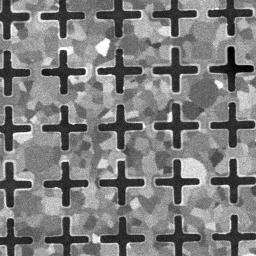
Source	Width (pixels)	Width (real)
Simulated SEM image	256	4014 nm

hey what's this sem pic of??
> an array of small figures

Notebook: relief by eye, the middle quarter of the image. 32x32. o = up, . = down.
.ooooooooooo...oooooooo.........
......oo............oo..........
......oo............ooo.........
.oooooooooooo..oooooooooooo..ooo
.oooooooooooo..oooooooooooo..ooo
.oooooooooooo..oooooooooooo..ooo
.oooooooooooo..oooooooooooo..ooo
.ooooooooooooooooooooooooooooooo
oooooooooooooooooooooooooooooooo
oooooooooooooooooooooooooooooooo
.oooooooooooo..oooooooooooo..ooo
.oooooooooooo..oooooooooooo..ooo
.oooooooooooo..oooooooooooo..ooo
.oooooooooooo..oooooooooooo..ooo
.ooooooooooo....ooooooo.........
......ooo...........oo..........
......ooo...........ooo.........
.oooooooooooo..oooooooooooo...oo
.oooooooooooo..oooooooooooo...oo
.oooooooooooo..oooooooooooo...oo
.oooooooooooo..oooooooooooo..ooo
.ooooooooooooo.ooooooooooooooooo
oooooooooooooooooooooooooooooooo
oooooooooooooooooooooooooooooooo
.oooooooooooo..oooooooooooo..ooo
.oooooooooooo..oooooooooooo..ooo
.oooooooooooo..oooooooooooo..ooo
.oooooooooooo..oooooooooooo..ooo
.oooooooooooo......oooo.........
......ooo...........ooo.........
......ooo...........oooo........
..ooooooooooo...ooooooooooo...oo